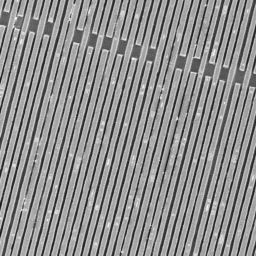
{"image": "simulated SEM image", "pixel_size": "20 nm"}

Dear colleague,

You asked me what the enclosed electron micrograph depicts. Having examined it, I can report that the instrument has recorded parallel lines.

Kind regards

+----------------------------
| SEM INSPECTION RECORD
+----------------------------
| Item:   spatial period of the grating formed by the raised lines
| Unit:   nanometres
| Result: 152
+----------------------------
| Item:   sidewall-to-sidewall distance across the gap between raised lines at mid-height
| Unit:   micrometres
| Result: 0.0389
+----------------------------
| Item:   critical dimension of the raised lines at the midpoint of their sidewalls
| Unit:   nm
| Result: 117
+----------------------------